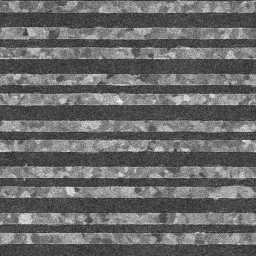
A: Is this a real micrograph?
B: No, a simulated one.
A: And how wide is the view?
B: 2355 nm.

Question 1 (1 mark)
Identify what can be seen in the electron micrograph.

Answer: parallel lines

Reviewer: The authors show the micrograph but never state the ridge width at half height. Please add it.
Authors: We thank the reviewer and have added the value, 0.101 µm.